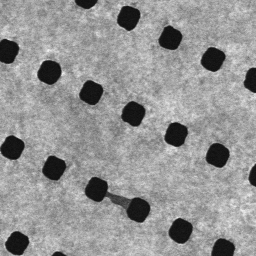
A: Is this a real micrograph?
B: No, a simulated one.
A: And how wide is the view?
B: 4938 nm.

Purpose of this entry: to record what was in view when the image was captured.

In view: a regular array of holes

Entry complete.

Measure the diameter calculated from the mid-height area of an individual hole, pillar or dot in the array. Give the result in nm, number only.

458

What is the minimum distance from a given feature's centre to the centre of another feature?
900 nm